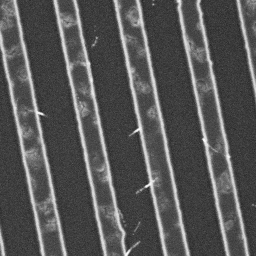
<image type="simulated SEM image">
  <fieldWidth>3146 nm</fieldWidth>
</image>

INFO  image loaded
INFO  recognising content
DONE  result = parallel lines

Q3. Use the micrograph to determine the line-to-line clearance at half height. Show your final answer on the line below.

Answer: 479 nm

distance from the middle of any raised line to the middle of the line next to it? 0.738 um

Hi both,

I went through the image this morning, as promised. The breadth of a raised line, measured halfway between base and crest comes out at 262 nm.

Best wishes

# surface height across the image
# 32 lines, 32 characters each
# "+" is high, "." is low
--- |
++.....++.....+++.....+++.....++
++.....+++.....+++....+++.....++
++.....+++.....+++.....++.....++
+++.....++.....+++.....++.....++
+++.....++.....+++.....+++.....+
+++.....++.....+++.....+++.....+
+++.....+++.....+++....+++.....+
.++.....+++.....+++.....++.....+
.+++....+++.....+++.....++.....+
.+++.....++.....+++.....+++.....
.+++.....+++....+++.....+++.....
.+++.....+++.....++.....+++.....
..++.....+++.....+++.....++.....
..+++....+++.....+++.....++.....
..+++.....++.....+++.....+++....
..+++.....++.....+++.....+++....
..+++.....+++.....++.....+++....
...++.....+++.....+++.....++....
...+++.....++.....+++.....++....
...+++.....++.....+++.....+++...
...+++.....++.....+++.....+++...
...+++.....+++.....+++....+++...
....++.....+++.....+++.....++...
....+++.....++.....+++.....++...
....+++.....++.....+++.....++...
....+++.....++.....+++.....+++..
....+++.....+++.....+++....+++..
.....++.....+++.....+++.....++..
.....+++....+++.....+++.....++..
.....+++.....+++....+++.....+++.
.....+++.....++.....+++.....+++.
.....+++.....+++.....+++....+++.